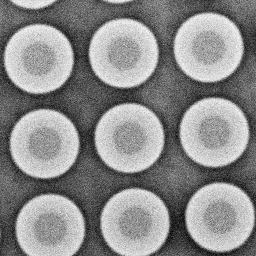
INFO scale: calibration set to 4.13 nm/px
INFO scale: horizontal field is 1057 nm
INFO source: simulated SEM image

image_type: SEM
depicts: an array of small figures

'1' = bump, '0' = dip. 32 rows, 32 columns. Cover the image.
00111100000000000000000000000000
00000000000000000000000000000000
00000000000000010000000011111000
00011110000001111100000111111100
00111111000011111110001111111100
01111111100111111111001111111100
01111111100111111111001111111100
01111111100111111111001111111100
01111111100011111110000111111000
01111111100011111110000011110000
00111111000000111000000000000000
00001100000000000000000000000000
00000000000000000000000001110000
00000000000000111100000011111100
00011111000001111110000111111100
00111111100011111111000111111110
00111111110011111111000111111110
01111111110011111111000111111110
01111111110011111111000111111110
00111111110001111111000011111100
00111111100001111110000001110000
00011111000000001000000000000000
00000000000000000000000000000000
00000000000000000000000001111100
00000110000000111111000011111110
00011111100001111111000011111110
00011111110001111111100111111111
00111111110001111111100111111111
00111111111001111111100111111111
00111111110001111111100011111110
00111111110000111111000001111100
00011111100000011110000000000000